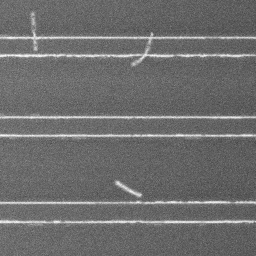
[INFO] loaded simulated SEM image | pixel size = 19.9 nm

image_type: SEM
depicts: lines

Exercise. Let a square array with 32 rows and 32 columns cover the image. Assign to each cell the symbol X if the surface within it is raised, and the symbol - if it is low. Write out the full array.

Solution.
--------------------------------
--------------------------------
--------------------------------
--------------------------------
--------------------------------
XXXXXXXXXXXXXXXXXXXXXXXXXXXXXXXX
XXXXXXXXXXXXXXXXXXXXXXXXXXXXXXXX
--------------------------------
--------------------------------
--------------------------------
--------------------------------
--------------------------------
--------------------------------
--------------------------------
--------------------------------
XXXXXXXXXXXXXXXXXXXXXXXXXXXXXXXX
XXXXXXXXXXXXXXXXXXXXXXXXXXXXXXXX
--------------------------------
--------------------------------
--------------------------------
--------------------------------
--------------------------------
--------------------------------
--------------------------------
--------------------------------
XXXXXXXXXXXXXXXXXXXXXXXXXXXXXXXX
XXXXXXXXXXXXXXXXXXXXXXXXXXXXXXXX
XXXXXXXXXXXXXXXXXXXXXXXXXXXXXXXX
--------------------------------
--------------------------------
--------------------------------
--------------------------------